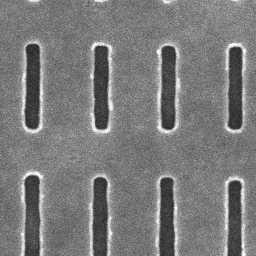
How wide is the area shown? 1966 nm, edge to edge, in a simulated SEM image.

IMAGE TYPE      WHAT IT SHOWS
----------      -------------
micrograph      holes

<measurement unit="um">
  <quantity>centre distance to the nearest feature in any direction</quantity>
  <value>0.514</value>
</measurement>